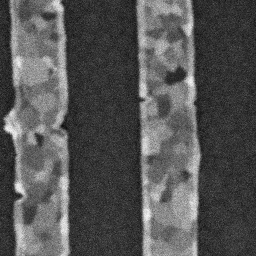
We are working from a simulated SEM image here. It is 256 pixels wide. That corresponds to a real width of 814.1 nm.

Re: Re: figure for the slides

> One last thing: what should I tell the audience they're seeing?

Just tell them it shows one or a few lines or trenches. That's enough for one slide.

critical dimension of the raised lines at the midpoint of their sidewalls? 156 nm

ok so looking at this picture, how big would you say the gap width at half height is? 0.254 µm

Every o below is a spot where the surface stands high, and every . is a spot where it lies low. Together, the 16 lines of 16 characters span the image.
.ooo.....ooo....
.ooo.....ooo....
.ooo.....ooo....
.ooo.....ooo....
.ooo.....ooo....
.ooo.....ooo....
.ooo.....ooo....
oooo.....ooo....
.ooo.....ooo....
.ooo.....ooo....
.ooo.....ooo....
.ooo.....ooo....
.ooo.....ooo....
.ooo.....ooo....
.ooo.....ooo....
.ooo.....ooo....